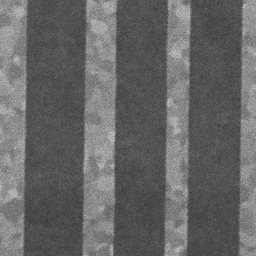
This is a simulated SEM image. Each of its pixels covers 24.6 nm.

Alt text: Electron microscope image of one or a few lines or trenches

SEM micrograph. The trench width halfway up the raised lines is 1.31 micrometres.